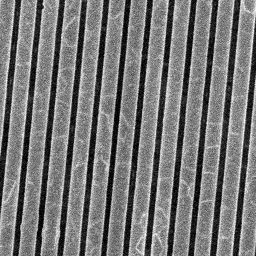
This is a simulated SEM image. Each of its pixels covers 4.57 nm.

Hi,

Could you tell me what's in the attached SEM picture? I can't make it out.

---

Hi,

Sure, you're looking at parallel lines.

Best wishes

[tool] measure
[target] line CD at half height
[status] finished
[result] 70.5 nm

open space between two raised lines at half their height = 29 nm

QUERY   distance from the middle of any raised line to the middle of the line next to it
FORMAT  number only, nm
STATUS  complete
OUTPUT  100